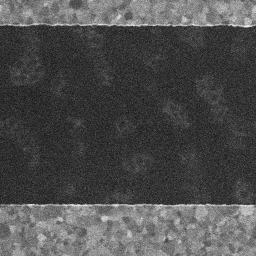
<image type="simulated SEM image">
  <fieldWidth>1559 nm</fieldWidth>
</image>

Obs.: one or a few lines or trenches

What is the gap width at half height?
180 pixels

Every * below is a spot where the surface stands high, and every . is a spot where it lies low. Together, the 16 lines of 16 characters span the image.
****************
**.*************
................
................
................
................
................
................
................
................
................
................
................
****************
****************
****************